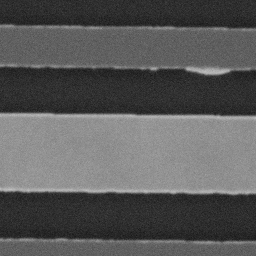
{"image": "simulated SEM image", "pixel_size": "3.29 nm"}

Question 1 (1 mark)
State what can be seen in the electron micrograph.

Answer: lines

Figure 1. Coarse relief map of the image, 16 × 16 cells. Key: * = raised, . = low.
................
................
****************
****************
............**..
................
................
****************
****************
****************
****************
****************
................
................
................
****************